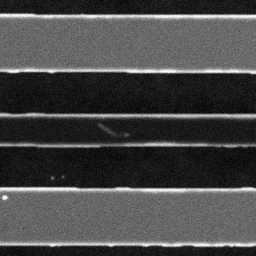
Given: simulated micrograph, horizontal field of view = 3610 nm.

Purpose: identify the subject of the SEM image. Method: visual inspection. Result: lines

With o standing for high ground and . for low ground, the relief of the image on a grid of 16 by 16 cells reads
................
oooooooooooooooo
oooooooooooooooo
oooooooooooooooo
oo.o....oooooooo
................
................
oooooooooooooooo
oooooooooooooooo
................
................
................
oooooooooooooooo
oooooooooooooooo
oooooooooooooooo
................